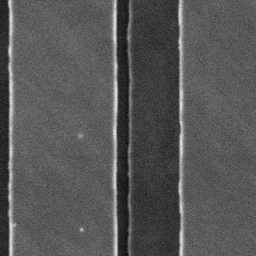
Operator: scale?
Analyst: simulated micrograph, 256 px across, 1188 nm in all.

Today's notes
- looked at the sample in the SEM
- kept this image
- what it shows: lines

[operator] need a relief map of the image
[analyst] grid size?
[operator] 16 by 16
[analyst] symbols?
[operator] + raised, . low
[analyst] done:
.++++++....+++++
.++++++....+++++
.++++++....+++++
.++++++....+++++
.++++++....+++++
.++++++....+++++
.++++++....+++++
.++++++....+++++
.++++++....+++++
.++++++....+++++
.++++++....+++++
.++++++....+++++
.++++++....+++++
.++++++....+++++
.++++++....+++++
.++++++....+++++